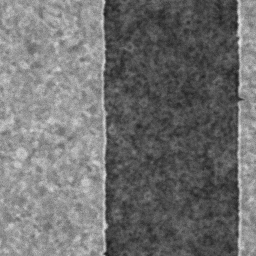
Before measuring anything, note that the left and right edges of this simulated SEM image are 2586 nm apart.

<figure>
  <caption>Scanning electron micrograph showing one or a few lines or trenches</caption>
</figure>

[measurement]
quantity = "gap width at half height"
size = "1.36 micrometres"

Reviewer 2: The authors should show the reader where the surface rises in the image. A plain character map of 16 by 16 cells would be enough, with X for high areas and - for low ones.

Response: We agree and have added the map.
XXXXXX---------X
XXXXXX---------X
XXXXXX---------X
XXXXXXX--------X
XXXXXX---------X
XXXXXX---------X
XXXXXX---------X
XXXXXXX--------X
XXXXXXX--------X
XXXXXXX--------X
XXXXXXX--------X
XXXXXXX--------X
XXXXXXX--------X
XXXXXXX--------X
XXXXXXX--------X
XXXXXXX--------X